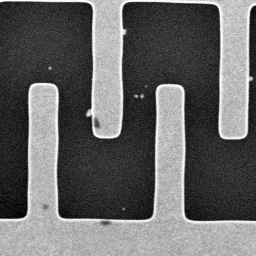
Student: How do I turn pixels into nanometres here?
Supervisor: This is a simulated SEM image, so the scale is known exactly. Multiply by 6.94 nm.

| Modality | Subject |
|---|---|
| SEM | groups of lines, slits or small figures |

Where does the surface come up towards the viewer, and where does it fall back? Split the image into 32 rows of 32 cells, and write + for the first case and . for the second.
...........+++++..........++++++
............+++............++++.
............+++............++++.
............+++.............+++.
............+++.............+++.
............+++.............+++.
............+++.............+++.
............+++.............+++.
............+++............++++.
............+++............++++.
....++......+++............++++.
....+++....++++....++++....++++.
....+++....++++....++++....++++.
....+++....++++.....+++....++++.
....+++....++++.....+++....++++.
....+++.....+++.....+++....++++.
....+++.....+++....++++....++++.
....+++............++++.........
....+++............++++.........
....+++............++++.........
....+++............++++.........
....+++............++++.........
....+++............++++.........
...++++............++++.........
...++++............++++.........
...++++............++++.........
...++++............++++.........
++++++++++++++....++++++........
++++++++++++++++++++++++++++++++
++++++++++++++++++++++++++++++++
++++++++++++++++++++++++++++++++
++++++++++++++++++++++++++++++++